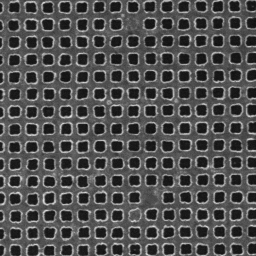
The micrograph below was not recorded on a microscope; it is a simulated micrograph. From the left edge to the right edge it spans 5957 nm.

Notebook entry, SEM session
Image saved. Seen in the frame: a regular array of holes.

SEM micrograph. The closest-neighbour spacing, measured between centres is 387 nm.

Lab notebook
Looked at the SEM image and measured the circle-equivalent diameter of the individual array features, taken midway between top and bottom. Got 273 nm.